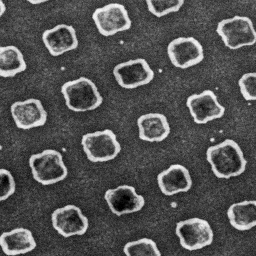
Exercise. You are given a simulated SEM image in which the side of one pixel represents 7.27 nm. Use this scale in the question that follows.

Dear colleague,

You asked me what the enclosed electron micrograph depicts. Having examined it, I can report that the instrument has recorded a regular array of raised bodies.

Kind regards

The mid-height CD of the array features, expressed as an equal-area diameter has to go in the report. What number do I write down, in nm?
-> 218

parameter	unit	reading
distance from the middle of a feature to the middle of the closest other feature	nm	403